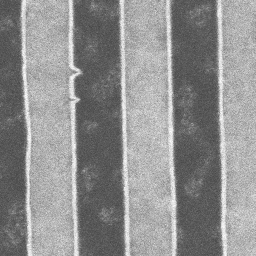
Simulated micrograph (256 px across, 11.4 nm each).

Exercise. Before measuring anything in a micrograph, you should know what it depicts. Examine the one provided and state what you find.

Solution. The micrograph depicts one or a few lines or trenches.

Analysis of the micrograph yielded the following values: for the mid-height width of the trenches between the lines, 0.514 µm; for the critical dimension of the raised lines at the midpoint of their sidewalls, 592 nanometres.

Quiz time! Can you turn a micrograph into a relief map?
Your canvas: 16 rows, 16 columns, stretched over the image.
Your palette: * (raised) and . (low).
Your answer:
**..****..****..
*...****...***..
*...****...***..
**..****...***..
**...***...***..
**..****...***..
**...***...***..
**...***...***..
**...***...***..
**...***...***..
**...***...***..
**...***...***..
**...***...***..
**...***...***..
**...***...***..
**...***...***..